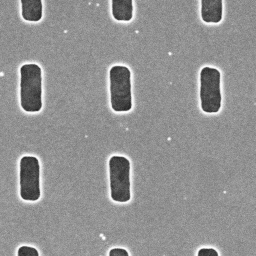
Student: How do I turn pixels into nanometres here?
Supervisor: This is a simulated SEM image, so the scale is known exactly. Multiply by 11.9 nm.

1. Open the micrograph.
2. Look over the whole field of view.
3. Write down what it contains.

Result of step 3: holes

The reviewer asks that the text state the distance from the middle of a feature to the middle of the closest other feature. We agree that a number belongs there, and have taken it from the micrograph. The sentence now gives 1070 nm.